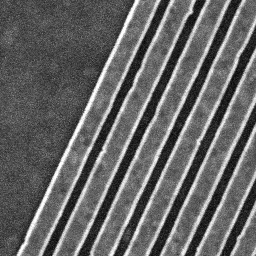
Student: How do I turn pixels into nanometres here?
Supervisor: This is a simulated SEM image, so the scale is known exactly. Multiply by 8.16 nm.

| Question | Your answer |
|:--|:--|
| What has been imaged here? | parallel lines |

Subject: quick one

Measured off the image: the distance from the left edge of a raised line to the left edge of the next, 263 nm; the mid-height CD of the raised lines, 163 nm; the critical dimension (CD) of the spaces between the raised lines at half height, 0.102 um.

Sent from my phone